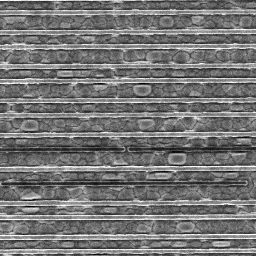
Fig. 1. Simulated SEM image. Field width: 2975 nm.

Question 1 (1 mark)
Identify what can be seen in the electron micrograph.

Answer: parallel lines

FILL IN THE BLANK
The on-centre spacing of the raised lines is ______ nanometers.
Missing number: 198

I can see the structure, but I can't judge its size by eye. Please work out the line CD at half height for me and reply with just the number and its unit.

49.4 nanometres